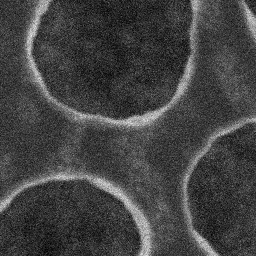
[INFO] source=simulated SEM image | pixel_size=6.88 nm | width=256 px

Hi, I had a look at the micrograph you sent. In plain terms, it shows holes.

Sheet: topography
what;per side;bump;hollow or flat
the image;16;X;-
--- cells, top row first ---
XXX---------XXX-
XX----------XXXX
XX----------XXXX
XX----------XXXX
XX----------XXXX
XXX--------XXXXX
XXXX------XXXXXX
XXXXXXXXXXXXXXXX
XXXXXXXXXXXXXX--
XXXXXXXXXXXXX---
XXXXXXXXXXXX----
XX-----XXXXX----
X-------XXXX----
--------XXXX----
---------XXX----
---------XXXX---